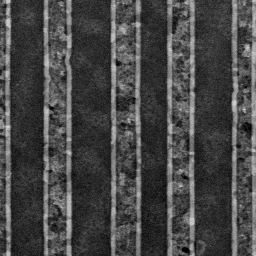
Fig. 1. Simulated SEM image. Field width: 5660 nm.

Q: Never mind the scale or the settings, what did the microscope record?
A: parallel lines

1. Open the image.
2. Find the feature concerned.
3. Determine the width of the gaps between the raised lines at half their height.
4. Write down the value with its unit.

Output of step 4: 898 nm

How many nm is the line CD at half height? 492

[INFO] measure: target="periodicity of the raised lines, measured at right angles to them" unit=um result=1.38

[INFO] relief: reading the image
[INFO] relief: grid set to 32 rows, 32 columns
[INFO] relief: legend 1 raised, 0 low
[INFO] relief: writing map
10000011100000111000011100000111
10000011100000111000011100000111
10000011100000111000011100000111
10000011100000111000011100000111
10000011100000111000011100000111
10000011100000111000011100000111
10000011100000111000011100000111
10000011000000111000011100000111
10000011100000111000011100000111
10000011100000111000011100000111
10000011100000111000011100000011
10000011100000111000011100000111
10000011100000111000011100000111
10000011100000111000011100000111
10000011100000111000011100000111
10000011100000111000011100000111
10000011100000111000011100000111
10000011100000111000011100000111
10000011100000111000011100000111
10000011100000111000011100000111
10000011100000111000011100000111
10000011100000111000011100000111
10000011100000111000011100000111
10000011100000111000011100000111
10000011100000111000011100000111
10000011100000111000011100000111
10000011100000111000011100000111
10000011100000111000011100000111
10000011100000111000011100000111
10000011100000111000011100000111
10000011100000111000011100000111
10000011100000111000011100000111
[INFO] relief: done